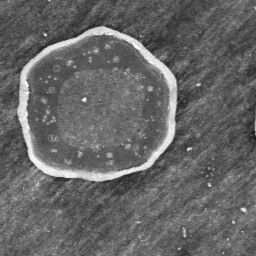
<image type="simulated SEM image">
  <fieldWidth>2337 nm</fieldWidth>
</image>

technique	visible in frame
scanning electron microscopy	raised bodies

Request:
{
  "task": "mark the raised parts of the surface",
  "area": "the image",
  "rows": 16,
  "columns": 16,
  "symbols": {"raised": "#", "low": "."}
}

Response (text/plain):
................
................
....####........
..#######.......
..########......
.##########.....
.##########.....
.##########.....
..#########.....
..########......
...######.......
................
................
................
................
................